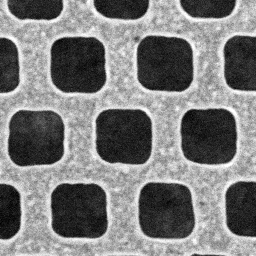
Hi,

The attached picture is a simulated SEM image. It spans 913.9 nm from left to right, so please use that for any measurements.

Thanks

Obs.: holes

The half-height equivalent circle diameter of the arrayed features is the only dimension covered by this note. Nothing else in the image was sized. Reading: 216 nanometers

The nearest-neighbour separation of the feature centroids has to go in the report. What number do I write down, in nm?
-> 301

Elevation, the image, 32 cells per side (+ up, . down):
+.......++++.......++++.......++
+.......++++......+++++......+++
+++++++++++++++..+++++++++++++++
++++++++++++++++++++++++++++++++
+++++++++++++++++++.+++++++++..+
..+++++......++++.......++++....
..++++.......++++.......++++....
..++++.......++++.......++++....
..++++.......++++.......++++....
...+++.......++++.......++++....
..+++++......+++++......++++....
.+++++++....+++++++++.++++++++++
++++++++++++++++++++++++++++++++
++++++++++++++++++++++++++.+++++
++.....+++++.......++++......+++
+.......++++.......++++.......++
+.......++++.......++++.......++
+.......++++.......++++.......++
+.......++++.......++++.......++
+.......++++.......++++......+++
++....+++++++++...++++++++..++++
++++++++++++++++++++++++++++++++
++++++++++++++++++++++++++++++++
..+++++......+++++.....++++++...
...+++.......++++.......++++....
...+++.......++++.......++++....
...+++.......++++.......++++....
...+++.......++++.......++++....
..++++.......+++++......++++....
..++++++.....+++++......++++++..
++++++++++++++++++++++++++++++++
++++++++++++++++++++++++++++++++